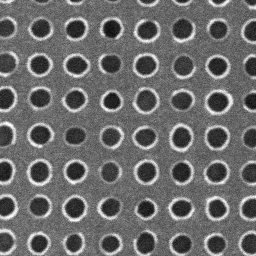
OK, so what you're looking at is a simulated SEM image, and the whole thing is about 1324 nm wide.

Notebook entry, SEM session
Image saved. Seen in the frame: a regular array of holes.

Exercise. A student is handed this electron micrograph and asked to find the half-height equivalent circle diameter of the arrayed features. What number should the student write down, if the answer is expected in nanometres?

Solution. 103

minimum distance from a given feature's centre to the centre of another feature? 34.8 px